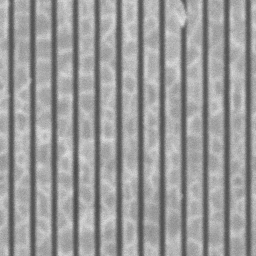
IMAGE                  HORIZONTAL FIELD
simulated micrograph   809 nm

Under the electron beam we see parallel lines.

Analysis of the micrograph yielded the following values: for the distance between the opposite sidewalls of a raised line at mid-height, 48.6 nm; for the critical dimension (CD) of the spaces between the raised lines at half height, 19 nm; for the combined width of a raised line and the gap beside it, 68 nm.